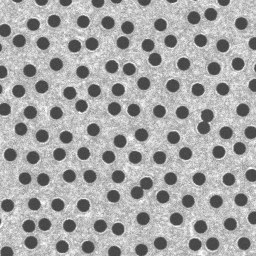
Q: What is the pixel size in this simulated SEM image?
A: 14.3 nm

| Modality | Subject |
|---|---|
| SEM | a regular array of holes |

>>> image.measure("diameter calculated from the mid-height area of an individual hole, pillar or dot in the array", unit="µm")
0.189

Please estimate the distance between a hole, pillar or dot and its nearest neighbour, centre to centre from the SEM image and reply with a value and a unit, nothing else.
294 nanometres